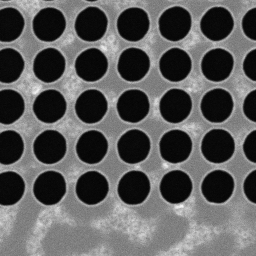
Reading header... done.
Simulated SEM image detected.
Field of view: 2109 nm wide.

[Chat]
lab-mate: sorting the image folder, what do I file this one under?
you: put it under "a regular array of holes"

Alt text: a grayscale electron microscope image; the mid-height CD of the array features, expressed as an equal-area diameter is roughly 277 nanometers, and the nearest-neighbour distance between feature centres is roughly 335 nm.